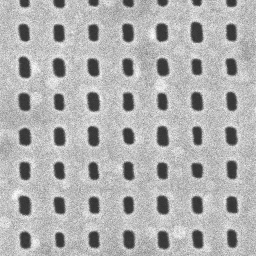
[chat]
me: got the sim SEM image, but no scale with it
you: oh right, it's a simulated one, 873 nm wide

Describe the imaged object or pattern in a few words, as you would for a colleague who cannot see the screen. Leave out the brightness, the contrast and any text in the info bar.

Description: a regular array of holes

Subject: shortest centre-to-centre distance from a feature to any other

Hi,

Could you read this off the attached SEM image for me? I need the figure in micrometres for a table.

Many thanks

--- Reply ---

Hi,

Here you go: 0.116